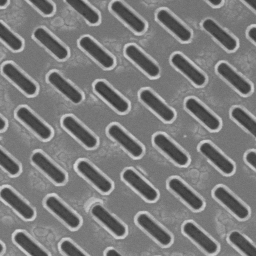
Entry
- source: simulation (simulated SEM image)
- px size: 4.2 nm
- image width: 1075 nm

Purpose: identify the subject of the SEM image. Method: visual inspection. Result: a regular array of holes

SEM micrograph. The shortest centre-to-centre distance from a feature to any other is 46.4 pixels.